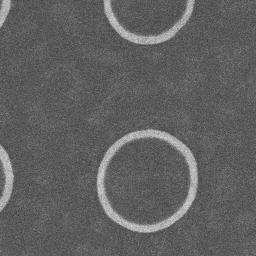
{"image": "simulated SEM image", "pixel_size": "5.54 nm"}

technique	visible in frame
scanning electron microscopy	raised bodies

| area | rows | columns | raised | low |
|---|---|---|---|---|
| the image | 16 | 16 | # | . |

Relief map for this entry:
.......#####....
.......####.....
................
................
................
................
................
................
........##......
.......#####....
#.....######....
#.....######....
......######....
.......####.....
................
................